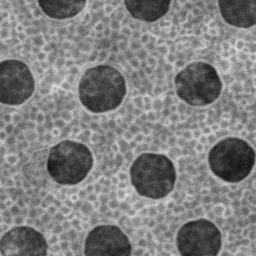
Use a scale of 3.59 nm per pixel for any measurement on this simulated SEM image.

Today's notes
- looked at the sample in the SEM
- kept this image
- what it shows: holes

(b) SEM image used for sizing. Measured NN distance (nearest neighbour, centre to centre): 0.295 um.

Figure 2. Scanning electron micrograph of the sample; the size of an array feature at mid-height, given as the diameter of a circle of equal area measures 47.1 pixels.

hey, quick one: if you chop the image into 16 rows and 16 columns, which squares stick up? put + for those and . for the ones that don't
+++..+++...+++..
++++++++++++++..
++++++++++++++++
++++++++++++++++
..+++..++++...++
..+++...+++...++
.++++...++++.+++
++++++++++++++++
++++++++++++++++
+++...+++++++...
+++...++...++...
++++.+++...+++++
++++++++++++++++
++++++++++++++++
..++++..+++...++
...++...+++...++